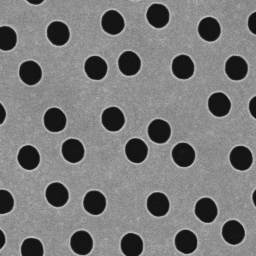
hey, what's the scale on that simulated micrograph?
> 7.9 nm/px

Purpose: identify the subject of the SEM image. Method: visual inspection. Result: a regular array of holes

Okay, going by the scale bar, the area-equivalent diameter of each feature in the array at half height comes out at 0.181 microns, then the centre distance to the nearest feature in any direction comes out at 0.311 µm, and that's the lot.